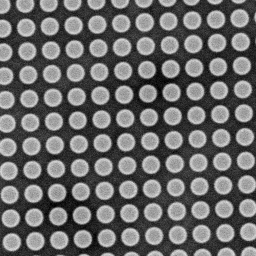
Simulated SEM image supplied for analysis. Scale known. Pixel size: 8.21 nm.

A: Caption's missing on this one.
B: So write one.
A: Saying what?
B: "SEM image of an array of small figures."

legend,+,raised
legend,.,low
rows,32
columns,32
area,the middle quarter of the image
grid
..++...+++...++++..++++..++++.++
.++++..++++..++++..++++..++++.++
.++++..++++..++++..++++..+++...+
.++++..+++...+++................
................................
....................++...+++...+
..++...++++..++++..++++..++++..+
.++++..++++..++++..++++..++++..+
.++++..++++..++++..++++..+++....
.++++...+++...++................
................................
....................++....+++..+
..+++...+++..++++..++++..++++..+
.++++..+++++.++++..++++..++++..+
.++++..++++..++++..++++...+++...
..+++...+++...++................
................................
...............+.....++...+++...
..+++...+++...+++...+++..++++..+
..++++..++++.+++++.+++++.++++..+
..++++..++++..+++...+++...+++...
..+++...+++....+................
................................
...............++...+++...+++...
..+++...++++..++++..++++..++++..
..++++..++++..++++..++++..++++..
..++++..++++..++++..++++..+++...
..+++....++.....................
................................
...............++....++...++++..
...+++..++++..++++..++++..++++..
..++++..++++..++++..++++..++++..